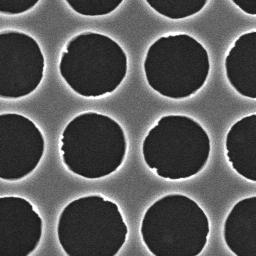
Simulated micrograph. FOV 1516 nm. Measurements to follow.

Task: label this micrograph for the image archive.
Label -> holes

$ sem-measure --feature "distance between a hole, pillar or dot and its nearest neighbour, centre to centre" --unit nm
479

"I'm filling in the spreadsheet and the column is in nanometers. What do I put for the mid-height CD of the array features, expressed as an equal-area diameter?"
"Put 382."